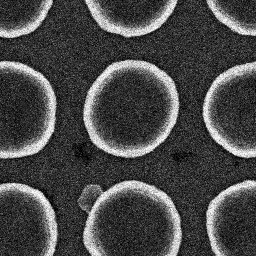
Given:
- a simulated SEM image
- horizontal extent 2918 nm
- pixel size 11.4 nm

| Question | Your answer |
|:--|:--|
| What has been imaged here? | raised bodies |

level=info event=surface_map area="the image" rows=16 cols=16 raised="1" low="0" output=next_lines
1110001111100111
1100000111000011
0000000000000000
0000000000000000
1100000111000011
1110001111100111
1110001111100111
1110011111100111
1110001111000111
1100000110000001
0000000000000000
0000000000000001
1110001111000011
1110001111100111
1110011111100111
1110001111100111